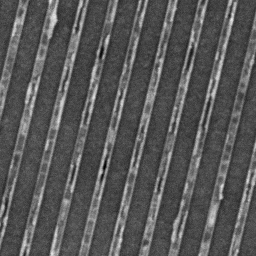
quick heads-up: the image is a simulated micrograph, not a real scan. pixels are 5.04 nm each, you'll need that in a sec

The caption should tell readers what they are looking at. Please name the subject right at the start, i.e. parallel lines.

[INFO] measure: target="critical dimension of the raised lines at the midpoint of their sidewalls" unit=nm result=41.1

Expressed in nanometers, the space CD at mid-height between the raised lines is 105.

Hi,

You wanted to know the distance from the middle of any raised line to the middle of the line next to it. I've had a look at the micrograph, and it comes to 147 nm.